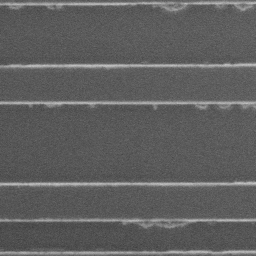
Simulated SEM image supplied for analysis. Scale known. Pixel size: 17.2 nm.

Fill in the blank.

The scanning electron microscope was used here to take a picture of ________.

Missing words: lines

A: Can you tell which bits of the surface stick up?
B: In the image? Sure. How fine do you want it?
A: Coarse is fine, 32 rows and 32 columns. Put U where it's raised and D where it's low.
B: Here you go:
UUUUUUUUUUUUUUUDDDDDUUUDDDDDDDDD
DDDDDDDDDDDDDDDDDDDDDDDDDDDDDDDD
DDDDDDDDDDDDDDDDDDDDDDDDDDDDDDDD
DDDDDDDDDDDDDDDDDDDDDDDDDDDDDDDD
DDDDDDDDDDDDDDDDDDDDDDDDDDDDDDDD
DDDDDDDDDDDDDDDDDDDDDDDDDDDDDDDD
DDDDDDDDDDDDDDDDDDDDDDDDDDDDDDDD
DDDDDDDDDDDDDDDDDDDDDDDDDDDDDDDD
UUUUUUUUUUUUUUUUUUUUUUUUUUUUUUUU
UUUUUUUUUUUUUUUUUUUUUUUUUUUUUUUU
UUUUUUUUUUUUUUUUUUUUUUUUUUUUUUUU
UUUUUUUUUUUUUUUUUUUUUUUUUUUUUUUU
UUUUUUUUUUUUUUUUUUUUUUUUUUUUUUUU
DDDDDDDDDDDDDDDDDDDDDDDDDDDDDDDD
DDDDDDDDDDDDDDDDDDDDDDDDDDDDDDDD
DDDDDDDDDDDDDDDDDDDDDDDDDDDDDDDD
DDDDDDDDDDDDDDDDDDDDDDDDDDDDDDDD
DDDDDDDDDDDDDDDDDDDDDDDDDDDDDDDD
DDDDDDDDDDDDDDDDDDDDDDDDDDDDDDDD
DDDDDDDDDDDDDDDDDDDDDDDDDDDDDDDD
DDDDDDDDDDDDDDDDDDDDDDDDDDDDDDDD
DDDDDDDDDDDDDDDDDDDDDDDDDDDDDDDD
DDDDDDDDDDDDDDDDDDDDDDDDDDDDDDDD
UUUUUUUUUUUUUUUUUUUUUUUUUUUUUUUU
UUUUUUUUUUUUUUUUUUUUUUUUUUUUUUUU
UUUUUUUUUUUUUUUUUUUUUUUUUUUUUUUU
UUUUUUUUUUUUUUUUUUUUUUUUUUUUUUUU
UUUUUUUUUUUUUUUUUUUUUUUUUUUUUUUU
DDDDDDDDDDDDDDDDDDDDDDDDDDDDDDDD
DDDDDDDDDDDDDDDDDDDDDDDDDDDDDDDD
DDDDDDDDDDDDDDDDDDDDDDDDDDDDDDDD
DDDDDDDDDDDDDDDDDDDDDDDDDDDDDDDD